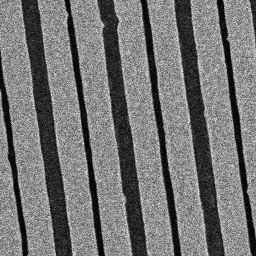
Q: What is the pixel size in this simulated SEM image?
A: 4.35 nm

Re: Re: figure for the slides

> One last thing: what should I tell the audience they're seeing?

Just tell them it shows parallel lines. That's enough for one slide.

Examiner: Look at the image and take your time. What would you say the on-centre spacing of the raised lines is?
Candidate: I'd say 167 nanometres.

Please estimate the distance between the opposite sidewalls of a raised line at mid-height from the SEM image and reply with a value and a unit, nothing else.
115 nanometers